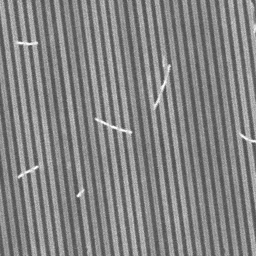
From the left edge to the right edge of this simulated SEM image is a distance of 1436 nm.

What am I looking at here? parallel lines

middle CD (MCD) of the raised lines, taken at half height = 25 nanometres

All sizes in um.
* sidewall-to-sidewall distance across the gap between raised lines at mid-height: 0.0298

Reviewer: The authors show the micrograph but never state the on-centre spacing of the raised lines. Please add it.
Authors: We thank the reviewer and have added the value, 0.051 micrometres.